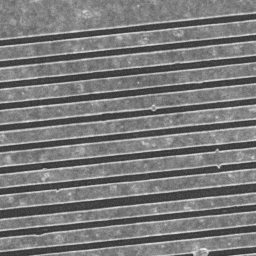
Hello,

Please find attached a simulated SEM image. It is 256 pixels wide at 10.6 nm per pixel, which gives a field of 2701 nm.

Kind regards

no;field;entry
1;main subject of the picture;parallel lines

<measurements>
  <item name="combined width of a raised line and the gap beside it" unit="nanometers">223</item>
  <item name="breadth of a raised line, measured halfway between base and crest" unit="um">0.143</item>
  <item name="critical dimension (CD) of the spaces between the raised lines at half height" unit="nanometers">85.3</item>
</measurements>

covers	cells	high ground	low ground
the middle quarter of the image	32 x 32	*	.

*********************...........
***********.....................
**.....................*********
.............*******************
....****************************
***********************.........
*************...................
*****....................*******
................****************
......**************************
****************************....
******************....*.........
********....................****
..................**************
.........***********************
****************************....
********************............
***********...................**
*......................*********
...........*********************
.*******************************
***********************.........
*************...................
****.....................*******
...............*****************
......**************************
***************************.....
****************................
******.....................*****
..................**************
........************************
******************************..